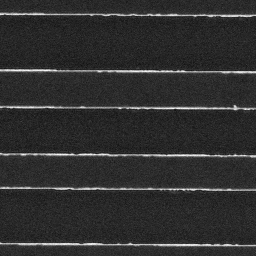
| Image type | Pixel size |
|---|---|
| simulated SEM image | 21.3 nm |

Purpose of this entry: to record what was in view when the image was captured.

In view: lines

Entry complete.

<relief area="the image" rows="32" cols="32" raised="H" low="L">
HHHHHHHHHHHHHHHHHHHHHHHHHHHHHHHH
HHHHHHHHHHHHHHHHHHHHHHHHHHHHHHHH
LLLLLLLLLLLLLLLLLLLLLLLLLLLLLLLL
LLLLLLLLLLLLLLLLLLLLLLLLLLLLLLLL
LLLLLLLLLLLLLLLLLLLLLLLLLLLLLLLL
LLLLLLLLLLLLLLLLLLLLLLLLLLLLLLLL
LLLLLLLLLLLLLLLLLLLLLLLLLLLLLLLL
LLLLLLLLLLLLLLLLLLLLLLLLLLLLLLLL
LLLLLLLLLLLLLLLLLLLLLLLLLLLLLLLL
HHHHHHHHHHHHHHHHHHHHHHHHHHHHHHHH
HHHHHHHHHHHHHHHHHHHHHHHHHHHHHHHH
HHHHHHHHHHHHHHHHHHHHHHHHHHHHHHHH
HHHHHHHHHHHHHHHHHHHHHHHHHHHHHHHH
LLLLLLLLLLLLLLHLHHHHHHHHHHHHHHHH
LLLLLLLLLLLLLLLLLLLLLLLLLLLLLLLL
LLLLLLLLLLLLLLLLLLLLLLLLLLLLLLLL
LLLLLLLLLLLLLLLLLLLLLLLLLLLLLLLL
LLLLLLLLLLLLLLLLLLLLLLLLLLLLLLLL
LLLLLLLLLLLLLLLLLLLLLLLLLLLLLLLL
HHHHHHHHHHHHHHHHHHHHHHHHHHLLLLLL
HHHHHHHHHHHHHHHHHHHHHHHHHHHHHHHH
HHHHHHHHHHHHHHHHHHHHHHHHHHHHHHHH
HHHHHHHHHHHHHHHHHHHHHHHHHHHHHHHH
HHHHHHHHHHHHHHHHHHHHHHHHHHHHHHHH
LLLLLLLLLLLLLLLLLLLLLLLLLLLLLLLL
LLLLLLLLLLLLLLLLLLLLLLLLLLLLLLLL
LLLLLLLLLLLLLLLLLLLLLLLLLLLLLLLL
LLLLLLLLLLLLLLLLLLLLLLLLLLLLLLLL
LLLLLLLLLLLLLLLLLLLLLLLLLLLLLLLL
LLLLLLLLLLLLLLLLLLLLLLLLLLLLLLLL
HHHHHHHHHHLHLLLLLLLLLLLLLLLLLLLL
HHHHHHHHHHHHHHHHHHHHHHHHHHHHHHHH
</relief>